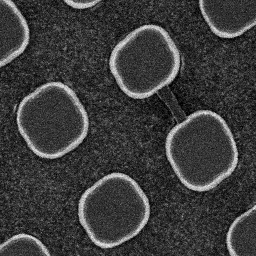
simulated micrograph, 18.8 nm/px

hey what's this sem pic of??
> raised bodies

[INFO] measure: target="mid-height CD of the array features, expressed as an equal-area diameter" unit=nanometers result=1280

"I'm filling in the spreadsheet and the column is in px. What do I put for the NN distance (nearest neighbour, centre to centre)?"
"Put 106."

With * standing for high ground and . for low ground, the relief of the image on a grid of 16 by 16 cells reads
*............***
**...........***
**......***.....
*......****.....
.......****.....
...*....**......
.****...........
.****.......**..
..***......***..
..**.......****.
...........****.
......**....*...
.....****.......
.....****......*
......***.....**
***...........**